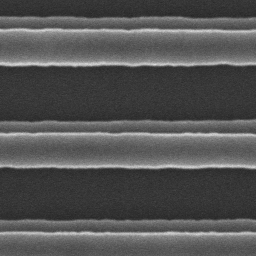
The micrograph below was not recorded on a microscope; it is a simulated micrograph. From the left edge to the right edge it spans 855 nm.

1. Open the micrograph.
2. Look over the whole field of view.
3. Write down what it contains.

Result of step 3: lines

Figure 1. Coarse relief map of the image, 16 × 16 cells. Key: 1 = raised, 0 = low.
0000000000000000
1111111111111111
1111111111111111
1111111111111111
0000000000000000
0000000000000000
0000000000000000
0000000000000000
1111111111111111
1111111111111111
0000100011011001
0000000000000000
0000000000000000
0000000000000000
1111111111111111
1111111111111111